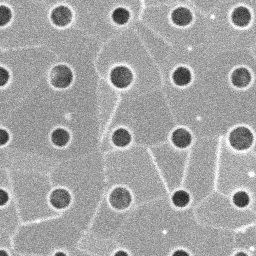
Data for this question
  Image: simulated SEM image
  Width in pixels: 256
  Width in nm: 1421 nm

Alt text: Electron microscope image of a regular array of holes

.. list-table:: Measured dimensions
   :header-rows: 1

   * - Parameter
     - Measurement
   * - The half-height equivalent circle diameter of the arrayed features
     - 0.119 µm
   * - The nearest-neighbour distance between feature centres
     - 332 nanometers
